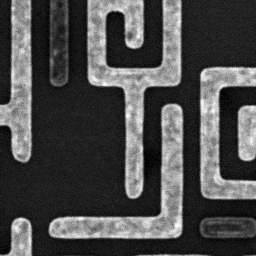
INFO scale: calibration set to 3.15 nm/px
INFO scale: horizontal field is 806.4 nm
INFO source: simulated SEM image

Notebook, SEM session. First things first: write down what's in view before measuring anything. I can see wiring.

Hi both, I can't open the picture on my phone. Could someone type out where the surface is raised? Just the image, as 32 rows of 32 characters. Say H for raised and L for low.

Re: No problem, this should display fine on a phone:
LLHHLLHHLLLHHHHHHHLLHHHLLLLLLLLL
LLHHLLHHLLLHHHLHHHLLHHHLLLLLLLLL
LLHHLLHHLLLHHLLLHHLLHHHLLLLLLLLL
LLHHLLHHLLLHHLLLHHLLHHHLLLLLLLLL
LLHHLLHHLLLHHLLLHHLLHHHLLLLLLLLL
LLHHLLHHLLLHHLLLHHLLHHHLLLLLLLLL
LLHHLLHHLLLHHLLLLLLLHHHLLLLLLLLL
LLHHLLHHLLLHHLLLLLLLHHHLLLLLLLLL
LLHHLLHHLLLHHHLLLLLLHHHLLLLLLLLL
LLHHLLHHLLLHHHHHHHHHHHHLLHHHHHHH
LLHHLLLHLLLLHHHHHHHHHHLLLHHHHHHH
LHHHLLLLLLLLLLLLHHLLLLLLLHHLLLLL
LHHHLLLLLLLLLLLLHHLLLLLLLHHLLLLL
HHHHLLLLLLLLLLLLHHLLHHHLLHHLLLHH
HHHHLLLLLLLLLLLLHHLLHHHLLHHLLLHH
HHHHLLLLLLLLLLLLHHLLHHHLLHHLLLHH
LHHHLLLLLLLLLLLLHHLLHHHLLHHLLLHH
LLHHLLLLLLLLLLLLHHLLHHHLLHHLLLHH
LLHHLLLLLLLLLLLLHHLLHHHLLHHLLLHH
LLHHLLLLLLLLLLLLHHLLHHHLLHHLLLHH
LLLLLLLLLLLLLLLLHHLLHHHLLHHLLLLL
LLLLLLLLLLLLLLLLHHLLHHHLLHHLLLLL
LLLLLLLLLLLLLLLLHHLLHHHLLHHHLLLL
LLLLLLLLLLLLLLLLHHLLHHHLLHHHHHHH
LLLLLLLLLLLLLLLLHLLLHHHLLLHHHHHH
LLLLLLLLLLLLLLLLLLLLHHHLLLLLLLLL
LLLLLLLLLLLLLLLLLLLLHHHLLLLLLLLL
LLHLLLLHHHHHHHHHHHHHHHHLLLHHHHHH
LLHHLLHHHHHHHHHHHHHHHHHLLHHHHHHH
LLHHLLLHHHHHHHHHHHHHHHLLLLHHHHHH
LHHHLLLLLLLLLLLLLLLLLLLLLLLLLLLL
LHHHLLLLLLLLLLLLLLLLLLLLLLLLLLLL